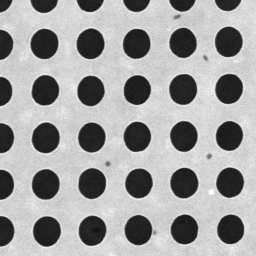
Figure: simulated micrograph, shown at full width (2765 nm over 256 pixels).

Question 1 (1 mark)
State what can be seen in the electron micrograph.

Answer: a regular array of holes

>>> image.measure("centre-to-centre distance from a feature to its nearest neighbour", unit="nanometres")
496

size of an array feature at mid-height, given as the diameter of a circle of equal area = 29.1 px